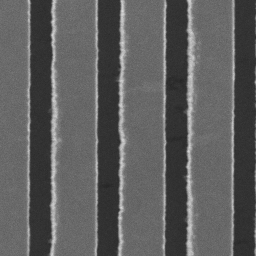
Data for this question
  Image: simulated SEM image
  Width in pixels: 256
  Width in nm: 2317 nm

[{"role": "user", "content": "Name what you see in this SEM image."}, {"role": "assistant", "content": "lines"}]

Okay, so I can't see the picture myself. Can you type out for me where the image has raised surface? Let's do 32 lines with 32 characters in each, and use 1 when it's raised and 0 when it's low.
11110001111100011111100111111000
11110011111100011111100111111000
11110011111100011111100111111000
11110011111100011111100111111000
11110011111100011111100111111000
11110011111100011111100111111000
11110001111100011111100111111000
11110011111100011111100111111000
11110011111100011111100111111000
11110011111100011111100111111000
11110011111100011111100111111000
11110011111100011111100111111000
11110011111100011111100111111000
11110001111100011111100111111000
11110011111100011111100111111000
11110011111100011111100111111000
11110011111100011111100111111000
11110011111100011111100111111000
11110011111100011111100111111000
11110011111100011111100111111000
11110011111100011111100111111000
11110011111100011111100111111000
11110011111100011111100111111000
11110011111100011111100111111000
11110011111100011111100111111000
11110011111100011111100111111000
11110011111100011111100111111000
11110011111100011111100111111000
11110011111100011111100111111000
11110011111100011111100111111000
11110011111100011111100111111000
11110011111100011111100111111000